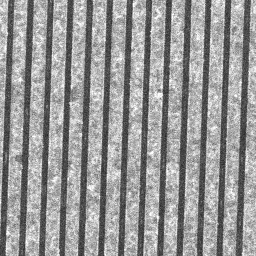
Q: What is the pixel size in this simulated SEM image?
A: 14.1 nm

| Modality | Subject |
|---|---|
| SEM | parallel lines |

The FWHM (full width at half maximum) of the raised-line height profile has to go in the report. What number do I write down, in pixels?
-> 12.7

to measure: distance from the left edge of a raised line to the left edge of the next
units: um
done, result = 0.279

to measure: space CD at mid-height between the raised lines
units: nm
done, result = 90.1